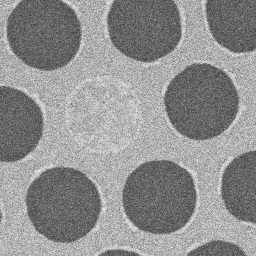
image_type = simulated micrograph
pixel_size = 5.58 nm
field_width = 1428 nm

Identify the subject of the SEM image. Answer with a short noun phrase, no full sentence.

holes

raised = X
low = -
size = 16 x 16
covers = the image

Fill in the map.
X---XXX----XX---
-----XX----XX---
X----XX----XXX--
X----XXX--XXXXXX
XXXXXXXXXXX---XX
-XXXXXXXXX-----X
--XXXXXXXX-----X
---XXXXXXXX----X
---XXXXXXXXX--XX
--XXXXXXXXXXXXXX
XXX-XXXXX--XXX--
XX----XX----XX--
XX----XX----XX--
XX----XX----XXX-
XX----XXX--XXXXX
XXXXXXXXXXXX---X